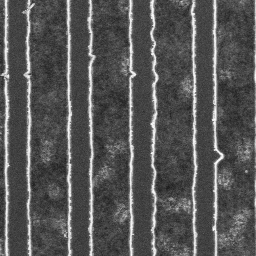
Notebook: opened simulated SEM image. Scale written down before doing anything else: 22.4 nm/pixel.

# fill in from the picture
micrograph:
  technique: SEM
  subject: one or a few lines or trenches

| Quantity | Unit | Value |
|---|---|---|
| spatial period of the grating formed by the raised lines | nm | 1400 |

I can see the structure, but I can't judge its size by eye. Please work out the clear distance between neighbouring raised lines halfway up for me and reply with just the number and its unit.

886 nm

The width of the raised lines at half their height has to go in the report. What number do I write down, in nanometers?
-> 496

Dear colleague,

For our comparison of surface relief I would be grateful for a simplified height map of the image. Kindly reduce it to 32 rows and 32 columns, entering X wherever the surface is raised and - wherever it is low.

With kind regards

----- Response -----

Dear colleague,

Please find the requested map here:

-XXX-----XX-----XXX-----XXX-----
-XXX-----XX-----XXX-----XXX-----
-XXX-----XX-----XXX-----XXX-----
-XXX-----XX-----XXX-----XXX-----
-XX------XX-----XXX-----XXX-----
-XX------XX-----XXX-----XXX-----
-XX------XX-----XXX-----XXX-----
-XXX-----XXX----XXX-----XXX-----
-XXX-----XX-----XXX-----XXX-----
-XXX-----XX-----XXX-----XXX-----
-XXX-----XX-----XXX-----XXX-----
-XXX-----XX-----XXX-----XXX-----
-XXX-----XX-----XXX-----XXX-----
-XXX-----XX-----XXX-----XXX-----
-XXX-----XX-----XXX-----XXX-----
-XXX-----XX-----XXX-----XXX-----
-XXX-----XX-----XXX-----XXX-----
-XXX-----XX-----XXX-----XXX-----
-XXX-----XX-----XXX-----XXX-----
-XXX-----XX------XX-----XXXX----
-XXX-----XX-----XXX-----XXX-----
-XXX-----XX-----XXX-----XXX-----
-XXX-----XX-----XXX-----XXX-----
-XXX-----XX-----XXX-----XXX-----
-XXX-----XX-----XXX-----XXX-----
-XXX-----XX-----XXX-----XXX-----
-XXX-----XX-----XXX-----XXX-----
-XXX-----XX------XX-----XXX-----
-XXX-----XX-----XXX-----XXX-----
-XXX-----XX-----XXX-----XXX-----
-XXX-----XX-----XXX-----XXX-----
-XXX-----XX-----XXX-----XXX-----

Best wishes